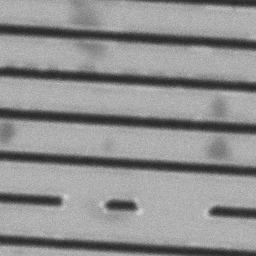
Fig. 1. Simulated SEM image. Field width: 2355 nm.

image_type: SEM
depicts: parallel lines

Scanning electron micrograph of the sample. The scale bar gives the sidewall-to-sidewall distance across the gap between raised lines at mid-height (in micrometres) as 0.244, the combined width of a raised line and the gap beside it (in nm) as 388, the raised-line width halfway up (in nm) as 142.